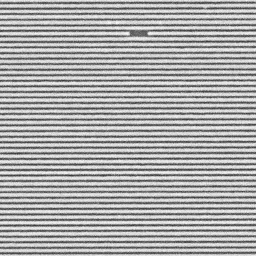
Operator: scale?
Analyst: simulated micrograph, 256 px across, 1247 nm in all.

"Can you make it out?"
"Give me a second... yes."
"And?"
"parallel lines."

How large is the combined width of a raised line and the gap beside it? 27.1 nanometers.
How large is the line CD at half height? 17 nm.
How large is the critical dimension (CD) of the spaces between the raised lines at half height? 0.0085 µm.